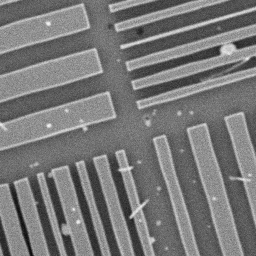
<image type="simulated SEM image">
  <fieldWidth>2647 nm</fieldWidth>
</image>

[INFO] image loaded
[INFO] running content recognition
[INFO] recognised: groups of lines, slits or small figures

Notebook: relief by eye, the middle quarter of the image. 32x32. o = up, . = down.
ooooooooo.......oooo..........oo
ooooooooo.................oooooo
oooooooo...............ooooooooo
ooooo...............oooooooo....
oo...............oooooooo.......
.................oooo..........o
...........................ooooo
.........oo.............oooooooo
......oooooo..........ooooooo...
..oooooooooo......oooooo........
oooooooooooo.......oo...........
oooooooooooo....................
ooooooooooooo...................
oooooooooooo....................
ooooooooo.......................
oooo............................
o..............................o
...............................o
.......................ooo......
.......................ooo......
.......................ooo......
.......................ooo......
.............oo........oooo.....
........ooo..oo.........ooo.....
....o...ooo...oo........ooo.....
...oo...ooo...oo........ooo.....
o...oo..oooo..ooo........ooo....
o...oo...ooo...oo........ooo....
oo..oo...ooo...oo........ooo....
oo..oo...ooo...oo.........ooo...
oo...o...oooo..ooo........ooo...
ooo..oo...ooo...oo........ooo...